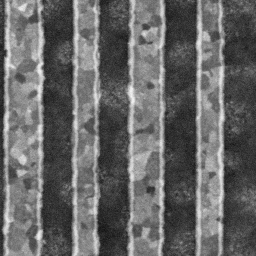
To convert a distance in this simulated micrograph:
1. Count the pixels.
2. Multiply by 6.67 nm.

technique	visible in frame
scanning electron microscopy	one or a few lines or trenches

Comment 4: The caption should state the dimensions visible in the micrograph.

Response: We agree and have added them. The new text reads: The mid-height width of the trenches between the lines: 36.8 px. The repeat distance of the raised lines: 415 nanometres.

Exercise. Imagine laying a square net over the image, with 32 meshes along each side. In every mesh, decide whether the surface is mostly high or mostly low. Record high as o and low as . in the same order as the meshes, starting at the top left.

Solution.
.oooo....ooo.....ooo.....ooo....
.oooo.....oo.....ooo.....ooo....
.oooo.....oo.....ooo.....ooo....
.oooo.....oo....oooo.....oo.....
.oooo.....oo.....ooo.....ooo....
.oooo.....oo....oooo.....ooo....
.oooo.....oo....oooo.....ooo....
.oooo.....oo....oooo.....ooo....
.oooo.....oo....oooo.....ooo....
.oooo.....oo....oooo.....ooo....
.oooo....ooo....oooo.....ooo....
.oooo....ooo....oooo.....ooo....
.oooo.....oo.....ooo.....ooo....
.oooo....ooo.....ooo.....ooo....
.oooo....ooo.....ooo.....ooo....
.oooo....ooo....oooo.....oo.....
.oooo....ooo....oooo.....oo.....
.oooo.....oo....oooo.....ooo....
.oooo....ooo....oooo.....ooo....
.oooo....ooo....oooo.....oo.....
.oooo....ooo.....ooo.....ooo....
.oooo....ooo....oooo.....ooo....
.oooo....ooo.....ooo.....ooo....
.oooo....ooo.....ooo.....ooo....
.oooo....ooo.....ooo.....ooo....
.oooo....ooo....oooo.....ooo....
.oooo.....oo....oooo.....ooo....
.oooo....ooo....oooo.....ooo....
.oooo....ooo....oooo.....ooo....
.oooo.....oo....oooo.....ooo....
.oooo.....oo....oooo.....ooo....
.oooo.....oo....oooo.....ooo....